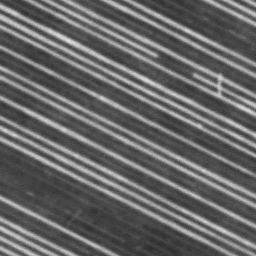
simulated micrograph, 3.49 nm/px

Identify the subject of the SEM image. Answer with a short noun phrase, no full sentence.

parallel lines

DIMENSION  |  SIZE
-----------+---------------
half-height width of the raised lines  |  0.0094 um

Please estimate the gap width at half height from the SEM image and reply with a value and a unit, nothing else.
23.4 nanometres